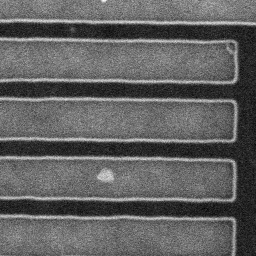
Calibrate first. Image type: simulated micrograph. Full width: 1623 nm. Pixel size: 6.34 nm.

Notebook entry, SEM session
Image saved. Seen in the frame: groups of lines, slits or small figures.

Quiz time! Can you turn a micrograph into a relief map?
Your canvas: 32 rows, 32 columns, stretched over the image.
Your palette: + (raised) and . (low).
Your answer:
................................
................................
................................
++++++++++++++++++++++++++++++++
++++++++++++++++++++++++++++++++
.............................+++
.............................+++
.............................+++
.............................+++
.............................+++
++++++++++++++++++++++++++++++++
++++++++++++++++++++++++++++++++
.................+++++++++++++++
.............................+++
.............................+++
.............................+++
.............................+++
++++++++++++.+..++...........+++
++++++++++++++++++++++++++++++++
++++++++++++++++++++++++++++++++
.............................+++
.............................+++
.............................+++
.............................+++
.............................+++
++++++++++++++++++++++++++++++++
++++++++++++++++++++++++++++++++
.............................+++
.............................+++
.............................+++
.............................+++
.............................+++